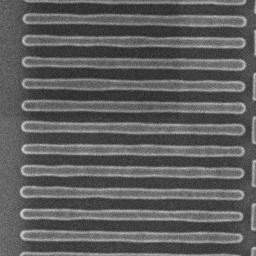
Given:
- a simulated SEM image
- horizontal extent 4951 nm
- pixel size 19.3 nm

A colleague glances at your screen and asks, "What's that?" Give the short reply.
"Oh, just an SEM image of groups of lines, slits or small figures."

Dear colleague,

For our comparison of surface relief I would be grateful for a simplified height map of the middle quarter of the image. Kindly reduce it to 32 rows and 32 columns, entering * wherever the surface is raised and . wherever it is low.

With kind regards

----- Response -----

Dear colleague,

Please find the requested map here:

********************************
................................
................................
................................
********************************
********************************
........................*******.
................................
................................
**************..................
********************************
********************************
................................
................................
................................
********************************
********************************
................................
................................
................................
***************...*****.........
********************************
..................**************
................................
................................
................................
********************************
********************************
................................
................................
................................
********************............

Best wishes